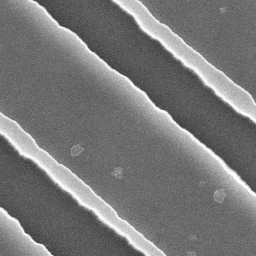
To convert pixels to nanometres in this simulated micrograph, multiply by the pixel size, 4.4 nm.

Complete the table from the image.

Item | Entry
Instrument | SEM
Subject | lines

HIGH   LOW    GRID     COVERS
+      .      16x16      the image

+++.....++++++++
++++.....+++++++
+++++.....++++++
++++++.....+++++
+++++++.....++++
+++++++++....+++
++++++++++....++
+++++++++++.....
++++++++++++....
.++++++++++++...
...+++++++++++..
....+++++++++++.
.....+++++++++++
+.....++++++++++
++.....+++++++++
+++......+++++++